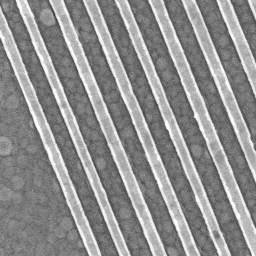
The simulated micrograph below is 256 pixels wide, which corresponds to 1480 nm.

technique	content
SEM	parallel lines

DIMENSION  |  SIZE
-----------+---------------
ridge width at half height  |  0.0609 microns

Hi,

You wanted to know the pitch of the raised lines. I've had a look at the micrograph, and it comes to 176 nanometers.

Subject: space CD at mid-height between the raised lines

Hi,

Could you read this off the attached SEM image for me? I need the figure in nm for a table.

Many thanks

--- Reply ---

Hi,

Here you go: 116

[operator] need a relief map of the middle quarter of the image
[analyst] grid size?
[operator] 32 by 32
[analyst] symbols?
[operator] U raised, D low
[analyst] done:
DDDUUUDDDDDDUUUDDDDDUUDDDDDDUUUD
DDDDUUDDDDDDUUUDDDDDUUUDDDDDUUUD
DDDDUUUDDDDDUUUDDDDDDUUDDDDDDUUU
DDDDDUUDDDDDDUUUDDDDDUUDDDDDDUUU
DDDDDUUUDDDDDUUUDDDDDUUUDDDDDUUU
DDDDDUUUDDDDDDUUUDDDDDUUDDDDDDUU
DDDDDDUUUDDDDDUUUDDDDDUUUDDDDDUU
DDDDDDUUUDDDDDUUUDDDDDDUUDDDDDDU
DDDDDDDUUUDDDDDUUUDDDDDUUDDDDDDU
UDDDDDDUUUDDDDDUUUDDDDDUUUDDDDDU
UDDDDDDUUUDDDDDDUUUDDDDDUUDDDDDD
UUDDDDDDUUUDDDDDUUUDDDDDUUUDDDDD
UUDDDDDDUUUDDDDDDUUDDDDDDUUDDDDD
UUUDDDDDDUUUDDDDDUUUDDDDDUUDDDDD
DUUDDDDDDUUUDDDDDUUUDDDDDUUUDDDD
DUUDDDDDDUUUDDDDDDUUUDDDDUUUDDDD
DUUUDDDDDDUUUDDDDDUUUDDDDDUUUDDD
DDUUDDDDDDUUUDDDDDDUUDDDDDUUUDDD
DDUUDDDDDDDUUDDDDDDUUUDDDDDUUUDD
DDDUUDDDDDDUUUDDDDDUUUDDDDDUUUDD
DDDUUDDDDDDUUUDDDDDDUUUDDDDDUUDD
DDDUUUDDDDDDUUUDDDDDUUUDDDDDUUUD
DDDDUUDDDDDDUUUDDDDDDUUUDDDDDUUD
DDDDUUDDDDDDDUUUDDDDDUUUDDDDDUUU
DDDDDUUDDDDDDUUUDDDDDUUUDDDDDDUU
DDDDDUUDDDDDDUUUDDDDDDUUUDDDDDUU
DDDDDUUUDDDDDDUUUDDDDDUUUDDDDDUU
UDDDDDUUDDDDDDUUUDDDDDDUUUDDDDDU
UDDDDDUUUDDDDDDUUUDDDDDUUUDDDDDU
UUDDDDDUUDDDDDDUUUDDDDDDUUDDDDDD
UUDDDDDUUDDDDDDUUUDDDDDDUUUDDDDD
UUDDDDDUUUDDDDDDUUUDDDDDUUUDDDDD